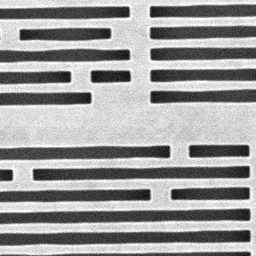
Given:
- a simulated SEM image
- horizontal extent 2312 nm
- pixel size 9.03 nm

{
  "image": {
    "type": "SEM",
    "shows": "groups of lines, slits or small figures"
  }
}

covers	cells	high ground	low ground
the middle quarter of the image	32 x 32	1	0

11111111111111111111111111111111
11111110000111111111110000000000
00111110000000000111100000000000
00111110000000000111100000000000
00111110000000000111110000000011
11111111111111111111111111111111
11111111111111111111111111111111
00000001111111111111100000000000
00000001111111111111100000000000
00000001111111111111100000000000
11111111111111111111111111111111
11111111111111111111111111111111
11111111111111111111111111111111
11111111111111111111111111111111
11111111111111111111111111111111
11111111111111111111111111111111
11111111111111111111111111111111
11111111111111111111111111111111
11111111111111111111111111111111
11111111111111111111111111111111
11111000000000000000000000011110
00000000000000000000000000011110
00000000000000000000000000011110
00000000000000000000000000111111
11111111111111111111111111111111
11111111111111111111111111000000
00000000000000000000000000000000
00000000000000000000000000000000
00000000000000000000000000000000
11111111111111111111111111111111
11111111111111111111111111111111
00000000000000000000001111100000